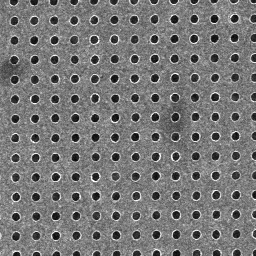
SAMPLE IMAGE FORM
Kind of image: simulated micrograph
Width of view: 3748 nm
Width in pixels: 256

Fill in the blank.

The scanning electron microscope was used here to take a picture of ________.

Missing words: a regular array of holes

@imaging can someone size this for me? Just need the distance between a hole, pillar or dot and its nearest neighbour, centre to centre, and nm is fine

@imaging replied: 284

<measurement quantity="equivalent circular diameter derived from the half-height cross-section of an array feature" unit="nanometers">124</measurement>